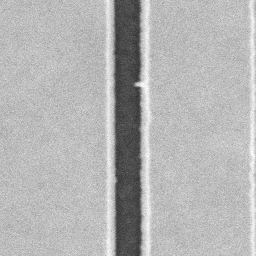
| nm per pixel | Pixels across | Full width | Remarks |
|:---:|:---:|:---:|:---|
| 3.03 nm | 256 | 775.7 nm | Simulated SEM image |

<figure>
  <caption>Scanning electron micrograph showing one or a few lines or trenches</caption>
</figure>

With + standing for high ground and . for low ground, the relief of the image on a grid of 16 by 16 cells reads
+++++++..+++++++
+++++++..+++++++
+++++++..+++++++
+++++++..+++++++
+++++++..+++++++
+++++++..+++++++
+++++++..+++++++
+++++++..+++++++
+++++++..+++++++
+++++++..+++++++
+++++++..+++++++
+++++++..+++++++
+++++++..+++++++
+++++++..+++++++
+++++++..+++++++
+++++++..+++++++